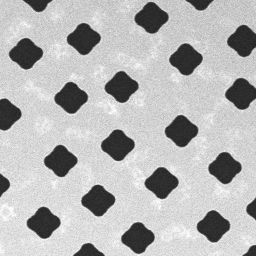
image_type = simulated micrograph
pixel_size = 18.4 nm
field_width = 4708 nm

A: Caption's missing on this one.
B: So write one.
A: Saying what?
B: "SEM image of a regular array of holes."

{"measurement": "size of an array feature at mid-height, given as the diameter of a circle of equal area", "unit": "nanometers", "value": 549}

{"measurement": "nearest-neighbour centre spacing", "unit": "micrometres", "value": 1.02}